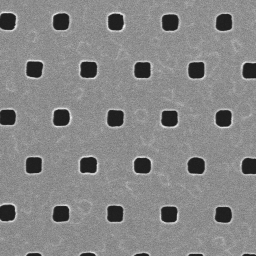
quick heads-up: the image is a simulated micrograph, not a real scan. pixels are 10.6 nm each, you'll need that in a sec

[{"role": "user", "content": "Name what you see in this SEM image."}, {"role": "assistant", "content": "a regular array of holes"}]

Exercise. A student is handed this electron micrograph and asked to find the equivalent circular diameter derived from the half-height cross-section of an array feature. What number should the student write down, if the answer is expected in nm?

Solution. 185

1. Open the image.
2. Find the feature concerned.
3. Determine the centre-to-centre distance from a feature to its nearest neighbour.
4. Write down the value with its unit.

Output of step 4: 54.1 px